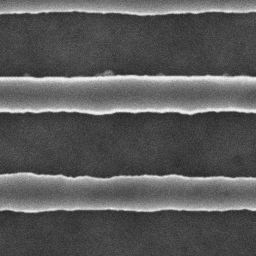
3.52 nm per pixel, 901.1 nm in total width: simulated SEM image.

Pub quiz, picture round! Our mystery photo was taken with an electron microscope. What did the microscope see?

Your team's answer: lines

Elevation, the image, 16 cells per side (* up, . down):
****************
................
................
................
................
****************
****************
................
................
................
................
****************
****************
................
................
................